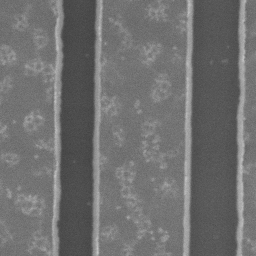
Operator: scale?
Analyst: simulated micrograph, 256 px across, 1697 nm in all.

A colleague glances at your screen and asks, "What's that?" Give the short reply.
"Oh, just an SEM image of one or a few lines or trenches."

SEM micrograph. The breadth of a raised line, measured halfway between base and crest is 0.607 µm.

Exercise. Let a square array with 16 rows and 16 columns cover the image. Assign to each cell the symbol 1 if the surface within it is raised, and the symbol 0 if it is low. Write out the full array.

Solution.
1111001111110001
1111001111110001
1111001111110001
1111001111110001
1111001111110001
1111001111110001
1111001111110001
1111001111110001
1111001111110001
1111001111110001
1111001111110001
1111001111110001
1111001111110001
1110001111110001
1110001111110001
1110001111110001